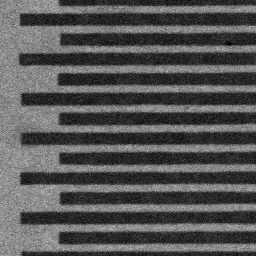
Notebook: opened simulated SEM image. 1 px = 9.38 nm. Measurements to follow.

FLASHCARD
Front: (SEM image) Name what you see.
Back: parallel lines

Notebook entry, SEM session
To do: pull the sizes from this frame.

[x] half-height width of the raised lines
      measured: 58.6 nanometres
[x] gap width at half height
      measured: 0.128 micrometres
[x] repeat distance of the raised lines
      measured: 186 nanometers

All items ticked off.